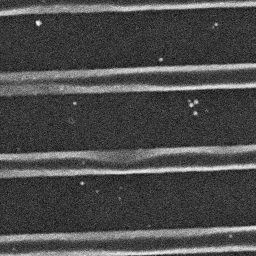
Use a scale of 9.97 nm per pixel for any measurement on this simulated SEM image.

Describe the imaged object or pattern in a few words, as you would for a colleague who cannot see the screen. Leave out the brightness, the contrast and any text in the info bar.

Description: lines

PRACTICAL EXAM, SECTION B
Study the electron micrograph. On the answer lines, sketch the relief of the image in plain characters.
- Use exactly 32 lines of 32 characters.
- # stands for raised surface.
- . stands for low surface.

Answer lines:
################################
###.............................
................................
................................
................................
................................
................................
................................
.......................#########
...#############################
################################
................................
................................
................................
................................
................................
................................
................................
..............................##
.....###########################
################################
################................
................................
................................
................................
................................
................................
................................
..............................##
...........#####################
################################
#####################...........